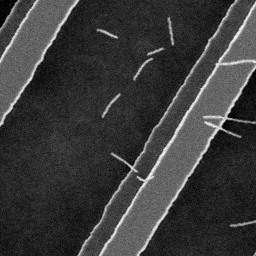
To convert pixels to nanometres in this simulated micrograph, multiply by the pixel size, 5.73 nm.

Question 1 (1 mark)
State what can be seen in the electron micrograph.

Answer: lines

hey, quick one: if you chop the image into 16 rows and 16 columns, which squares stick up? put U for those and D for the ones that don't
DUUUUDDDDDDDDDUU
UUUUDDDDDDDDDDUU
UUUDDDDDDDDDDUUU
UUUDDDDDDDDDDUUU
UUDDDDDDDDDDUUUU
UUDDDDDDDDDUUUUD
UDDDDDDDDDDUUUUD
DDDDDDDDDDUUUUDD
DDDDDDDDDUUUUDDD
DDDDDDDDDUUUUDDD
DDDDDDDDUUUUDDDD
DDDDDDDDUUUUDDDD
DDDDDDDUUUUDDDDD
DDDDDDUUUUDDDDDD
DDDDDDUUUUDDDDDD
DDDDDUUUUDDDDDDD